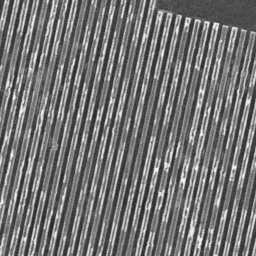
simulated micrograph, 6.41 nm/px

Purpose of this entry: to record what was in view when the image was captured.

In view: parallel lines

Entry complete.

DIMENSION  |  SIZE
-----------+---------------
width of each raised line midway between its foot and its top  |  4.76 pixels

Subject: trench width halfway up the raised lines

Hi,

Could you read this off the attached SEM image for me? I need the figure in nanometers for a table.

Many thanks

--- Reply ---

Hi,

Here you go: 30.5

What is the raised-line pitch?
60.9 nm